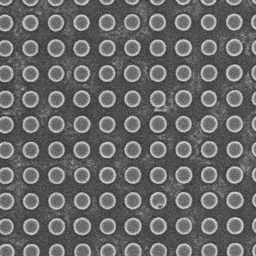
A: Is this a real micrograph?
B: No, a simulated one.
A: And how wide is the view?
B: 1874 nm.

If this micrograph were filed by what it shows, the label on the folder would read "a regular array of raised bodies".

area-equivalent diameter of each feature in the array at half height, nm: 116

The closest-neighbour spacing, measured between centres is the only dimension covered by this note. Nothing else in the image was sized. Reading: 184 nm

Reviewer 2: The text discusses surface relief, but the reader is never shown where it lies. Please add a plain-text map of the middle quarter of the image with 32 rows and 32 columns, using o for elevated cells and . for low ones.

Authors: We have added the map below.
................oo..............
...ooo...ooo...oooo...ooo...oooo
...ooo...oooo..oooo...ooo...oooo
...ooo...ooo...oooo...ooo...ooo.
................................
................................
................................
...ooo...ooo....ooo...ooo...oooo
...ooo...oooo..oooo...ooo...oooo
...ooo...oooo..oooo...ooo...oooo
....o.....oo....oo....oo.....oo.
................................
................................
...ooo....oo....oo....ooo....oo.
...ooo...oooo..oooo...ooo...oooo
...ooo...oooo..oooo...ooo...oooo
...ooo...ooo....oo....ooo....oo.
................................
................................
................oo.....o.....oo.
...ooo...ooo...oooo...ooo...oooo
...ooo...oooo..oooo...ooo...oooo
...ooo...ooo...oooo...ooo...ooo.
................................
................................
................................
...ooo...ooo....ooo...ooo...oooo
...ooo...oooo..oooo...oooo..oooo
...ooo...oooo..oooo...oooo..oooo
...oo.....oo....ooo....oo....oo.
................................
................................